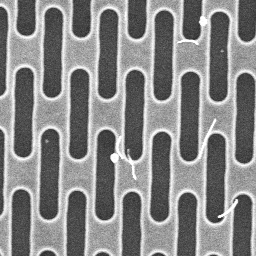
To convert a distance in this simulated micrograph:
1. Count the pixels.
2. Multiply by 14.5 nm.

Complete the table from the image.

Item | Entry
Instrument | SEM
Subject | groups of lines, slits or small figures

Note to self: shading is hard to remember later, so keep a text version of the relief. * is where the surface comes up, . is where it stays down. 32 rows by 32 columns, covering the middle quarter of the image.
********.....*********.....*****
**....**.....***...***......****
**....**.....***....**......**..
*......*.....**.....**......*...
*......*.....**.....**.....**...
*......*.....**.....**.....**...
*......*.....**.....**.....**...
*......**....**.....**.....**...
*.....***...***.....***...***...
*.....*********.....*********...
*.....*********.....*********...
*.....*********.....*********...
*.....*********.....*********...
*.....*********.....*********...
*.....*********.....*********...
*.....*********.....*********...
*.....***...***.....*********...
*.....**.....**.....***...***...
*.....**.....**.....**.....**...
*.....**.....**.....**.....*....
*.....**.....**.....**.....**...
*.....**.....**.....**.....**...
*.....**....***.....**.....**...
**...***....****...***.....**...
********....**********.....****.
********.....*********.....*****
********.....*********.....*****
********.....*********.....*****
********.....*********.....*****
********.....*********.....*****
********.....*********.....*****
**..****.....*********.....*****